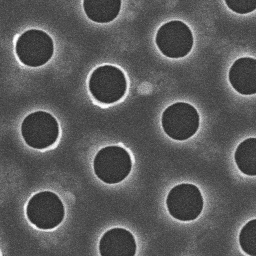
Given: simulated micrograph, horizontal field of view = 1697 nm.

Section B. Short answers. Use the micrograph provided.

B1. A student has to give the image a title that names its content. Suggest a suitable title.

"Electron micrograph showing a regular array of holes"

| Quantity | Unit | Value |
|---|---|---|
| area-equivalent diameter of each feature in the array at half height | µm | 0.253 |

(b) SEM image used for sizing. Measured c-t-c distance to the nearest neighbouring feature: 535 nm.